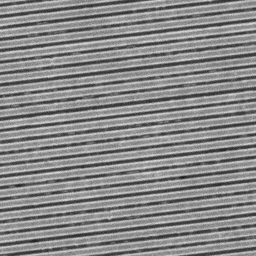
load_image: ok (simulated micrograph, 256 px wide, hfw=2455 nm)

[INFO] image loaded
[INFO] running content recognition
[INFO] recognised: parallel lines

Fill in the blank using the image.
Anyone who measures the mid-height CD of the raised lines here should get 0.0619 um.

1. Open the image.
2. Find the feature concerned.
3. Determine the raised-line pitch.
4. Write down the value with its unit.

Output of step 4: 109 nm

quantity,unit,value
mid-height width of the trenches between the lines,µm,0.044